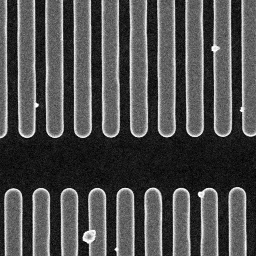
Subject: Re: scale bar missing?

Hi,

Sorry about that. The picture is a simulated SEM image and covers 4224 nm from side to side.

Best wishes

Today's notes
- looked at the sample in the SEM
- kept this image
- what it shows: groups of lines, slits or small figures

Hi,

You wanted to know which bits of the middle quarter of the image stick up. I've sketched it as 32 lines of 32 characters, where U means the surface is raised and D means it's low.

DDDUUUUDDDUUUDDDDUUUUDDUUUUUDDUU
DDDUUUUDDDUUUDDDDUUUUDDUUUUUDDUU
DDDUUUUDDDUUUDDDDUUUUDDDUUUUDDUU
DDDUUUUDDDUUUDDDDUUUUDDDUUUUDDDU
DDDUUUUDDDUUUUDDDUUUUDDDUUUUDDDU
DDDUUUUDDDUUUUDDDUUUUDDDUUUUDDDU
DDDUUUUDDDUUUUDDDUUUUDDDUUUUDDDU
DDDUUUUDDDUUUUDDDUUUUDDDUUUUDDDU
DDDUUUUDDDUUUUDDDUUUUDDDUUUUDDDU
DDDUUUUDDDUUUUDDDUUUUDDDUUUUDDDU
DDDUUUUDDDUUUUDDDUUUUDDDUUUUDDDU
DDDUUUUDDDUUUUDDDUUUUDDDUUUUDDDU
DDDUUUUDDDUUUUDDDUUUUDDDUUUUDDDU
DDDUUUUDDDUUUUDDDUUUUDDDUUUUDDDU
DDDUUUUDDDUUUUDDDUUUUDDDUUUUDDDU
DDDUUUUDDDUUUUDDDUUUUDDDUUUUDDDU
DDDUUUUDDDUUUUDDDUUUUDDDUUUUDDDU
DDDUUUDDDDUUUDDDDUUUDDDDUUUDDDDU
DDDDDDDDDDDDDDDDDDDDDDDDDDDDDDDD
DDDDDDDDDDDDDDDDDDDDDDDDDDDDDDDD
DDDDDDDDDDDDDDDDDDDDDDDDDDDDDDDD
DDDDDDDDDDDDDDDDDDDDDDDDDDDDDDDD
DDDDDDDDDDDDDDDDDDDDDDDDDDDDDDDD
DDDDDDDDDDDDDDDDDDDDDDDDDDDDDDDD
DDDDDDDDDDDDDDDDDDDDDDDDDDDDDDDD
DDDDDDDDDDDDDDDDDDDDDDDDDDDDDDDD
DDDDDDDDDDDDDDDDDDDDDDDDDDDDDDDD
DDDDDDDDDDDDDDDDDDDDDDDDDDDDDDDD
DDDDDDDDDDDDDDDDDDDDDDDDDDDDDDDD
DDDDDDDDDDDDDDDDDDDDDDDDDDDDDDDD
DDDDDDDDDDDDDDDDDDDDDDDDDDDDDDDD
UUUDDDDUUUDDDDUUUDDDDUUDDDDDUUDD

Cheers